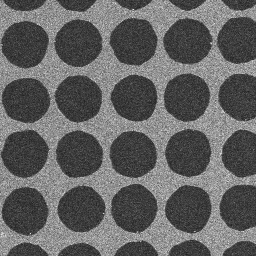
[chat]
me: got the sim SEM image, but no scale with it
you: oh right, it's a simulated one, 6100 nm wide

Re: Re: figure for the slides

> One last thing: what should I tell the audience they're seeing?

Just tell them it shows a regular array of holes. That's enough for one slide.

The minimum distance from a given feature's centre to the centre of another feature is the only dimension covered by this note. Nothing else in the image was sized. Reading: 1.27 µm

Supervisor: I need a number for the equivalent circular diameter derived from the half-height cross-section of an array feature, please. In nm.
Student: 1120